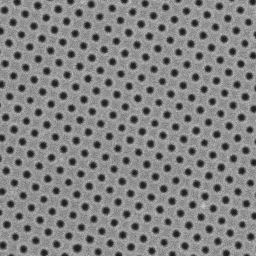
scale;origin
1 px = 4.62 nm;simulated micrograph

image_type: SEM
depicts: a regular array of holes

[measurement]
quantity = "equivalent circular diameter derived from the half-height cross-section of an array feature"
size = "0.0353 µm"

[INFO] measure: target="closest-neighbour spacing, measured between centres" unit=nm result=67.6